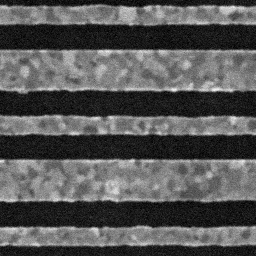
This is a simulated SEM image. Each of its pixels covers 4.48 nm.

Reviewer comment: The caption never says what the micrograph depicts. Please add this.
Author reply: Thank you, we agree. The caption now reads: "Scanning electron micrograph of lines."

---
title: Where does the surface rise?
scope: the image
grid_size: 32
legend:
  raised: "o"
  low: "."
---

................................
oooooooooooooooooooooooooooooooo
oooooooooooooooooooooooooooooooo
................................
................................
................................
oooooooooooooooooooooooooooooooo
oooooooooooooooooooooooooooooooo
oooooooooooooooooooooooooooooooo
oooooooooooooooooooooooooooooooo
oooooooooooooooooooooooooooooooo
................................
................................
................................
o....oooo.......................
oooooooooooooooooooooooooooooooo
oooooooooooooooooooooooooooooooo
................................
................................
................................
oooooooooooooooooooooooooooooooo
oooooooooooooooooooooooooooooooo
oooooooooooooooooooooooooooooooo
oooooooooooooooooooooooooooooooo
oooooooooooooooooooooooooooooooo
................................
................................
................................
o.oooo.oo....o..ooo.ooo.o..ooooo
oooooooooooooooooooooooooooooooo
oooooooooooooooooooooooooooooooo
................................